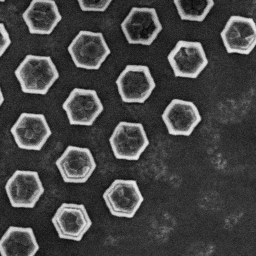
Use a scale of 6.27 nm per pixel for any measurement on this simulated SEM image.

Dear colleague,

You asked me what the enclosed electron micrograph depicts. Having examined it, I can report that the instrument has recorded a regular array of raised bodies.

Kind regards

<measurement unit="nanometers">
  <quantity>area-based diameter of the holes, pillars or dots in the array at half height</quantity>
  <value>219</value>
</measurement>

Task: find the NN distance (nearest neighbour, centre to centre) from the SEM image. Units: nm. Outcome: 355